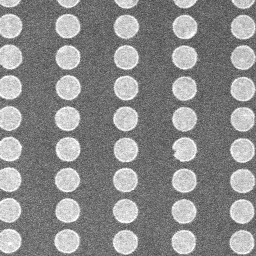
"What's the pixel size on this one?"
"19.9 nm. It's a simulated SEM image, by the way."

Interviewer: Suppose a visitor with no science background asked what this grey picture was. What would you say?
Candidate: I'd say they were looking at a regular array of raised bodies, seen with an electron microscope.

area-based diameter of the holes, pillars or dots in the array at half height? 463 nm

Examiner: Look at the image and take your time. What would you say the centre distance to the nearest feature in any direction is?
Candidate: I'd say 608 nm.